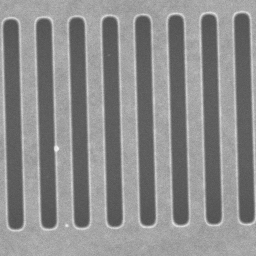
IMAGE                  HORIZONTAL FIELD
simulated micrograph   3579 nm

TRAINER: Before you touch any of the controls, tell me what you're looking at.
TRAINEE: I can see groups of lines, slits or small figures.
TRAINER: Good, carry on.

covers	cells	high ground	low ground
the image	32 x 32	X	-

XXXXXXXXXXXXXXXXXXXXXXXXXXXXXXXX
XXXXXXXXXXXXXXXXXXXXXXXXXXXXXXXX
X-XXX-XXX-XXX--XX--XX--XX--XX--X
--XX---XX--XX--XX--XX--XX--XX--X
--XX---XX--XX--XX--XX--XX--XX--X
--XX---XX--XX--XX--XX--XX--XX--X
--XXX--XX--XX--XX--XX--XX--XX--X
---XX--XX--XX--XX--XX--XX--XX--X
---XX--XX--XX--XX--XX--XX--XX--X
---XX--XX--XX--XX--XX--XX--XX--X
---XX--XX--XX--XX--XX--XX--XX--X
---XX--XX--XX--XX--XX--XX--XX---
X--XX--XX--XX--XX--XX--XX--XX---
X--XX--XX--XX--XX--XX--XX--XX---
X--XX--XX--XX--XX--XX--XX--XX---
X--XX--XX--XX--XX--XX--XX--XXX--
X--XX--XX--XX--XX--XX--XX---XX--
X--XX--XX--XX--XX--XX--XX---XX--
X--XX--XX--XX--XX--XX--XX---XX--
X--XX--XX--XX--XX--XX--XX---XX--
X--XX--XX--XX--XX--XX--XX---XX--
X--XX--XX--XX--XX--XX--XXX--XX--
X--XX--XX--XX--XX--XX---XX--XX--
X--XX--XX--XX--XX--XX---XX--XX--
X--XX--XX--XX--XX--XX---XX--XX--
X--XX--XX--XX--XX--XX---XX--XX--
X--XX--XX--XX--XX--XXX--XX--XX--
X--XX--XX--XX--XXX-XXX--XX--XX--
X-XXXXXXXXXXXXXXXXXXXXXXXXXXXXXX
XXXXXXXXXXXXXXXXXXXXXXXXXXXXXXXX
XXXXXXXXXXXXXXXXXXXXXXXXXXXXXXXX
XXXXXXXXXXXXXXXXXXXXXXXXXXXXXXXX